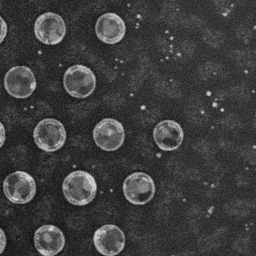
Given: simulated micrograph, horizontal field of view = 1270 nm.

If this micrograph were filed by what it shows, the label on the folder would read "a regular array of raised bodies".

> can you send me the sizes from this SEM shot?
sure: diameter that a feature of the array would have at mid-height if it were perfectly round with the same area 0.153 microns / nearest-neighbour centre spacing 0.295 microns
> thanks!